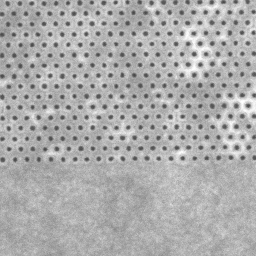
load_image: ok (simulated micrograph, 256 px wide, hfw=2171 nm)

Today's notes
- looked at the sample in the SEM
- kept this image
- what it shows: a regular array of holes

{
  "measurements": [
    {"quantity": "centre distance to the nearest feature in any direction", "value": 98.3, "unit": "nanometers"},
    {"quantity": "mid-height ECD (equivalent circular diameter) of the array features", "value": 41.7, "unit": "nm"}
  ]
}